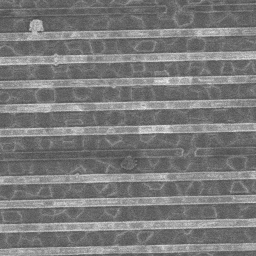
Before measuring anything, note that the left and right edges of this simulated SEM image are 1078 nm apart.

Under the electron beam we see parallel lines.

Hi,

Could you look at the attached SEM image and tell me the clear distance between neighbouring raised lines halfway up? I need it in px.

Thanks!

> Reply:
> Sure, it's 16.4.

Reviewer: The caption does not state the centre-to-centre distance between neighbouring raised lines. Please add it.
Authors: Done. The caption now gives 23.9 px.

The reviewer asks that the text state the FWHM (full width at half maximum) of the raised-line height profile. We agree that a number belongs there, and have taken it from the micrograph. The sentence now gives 30.5 nanometers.